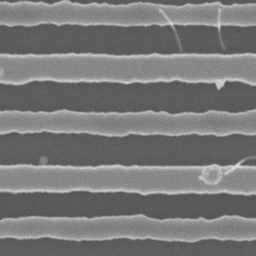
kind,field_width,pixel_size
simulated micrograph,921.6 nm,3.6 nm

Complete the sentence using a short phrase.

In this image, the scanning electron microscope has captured lines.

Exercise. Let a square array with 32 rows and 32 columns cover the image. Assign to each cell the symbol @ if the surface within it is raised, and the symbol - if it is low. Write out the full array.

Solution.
@@@@@@@@@@@@@@--@@@@---@-@@@-@@@
@@@@@@@@@@@@@@@@@@@@@@@@@@@@@@@@
@@@@@@@@@@@@@@@@@@@@@@@@@@@@@@@@
--------------------------------
--------------------------------
--------------------------------
--------------------------------
@@@@@@@@@@@@@@@@@@@@@@@@@@@@@@@@
@@@@@@@@@@@@@@@@@@@@@@@@@@@@@@@@
@@@@@@@@@@@@@@@@@@@@@@@@@@@@@@@@
-@@------------------------@---@
--------------------------------
--------------------------------
--------------------------------
@@@@@@@@@@@@@@@@@@@@@@@@@@@@@@@@
@@@@@@@@@@@@@@@@@@@@@@@@@@@@@@@@
@@@@@-@@@@@@@@@@@@@@@@@@@@@@@@@@
--------------------------------
--------------------------------
--------------------------------
--------------------------------
@@@@@@@@@@@@@@@@@@@@@@@@@@@@@@@@
@@@@@@@@@@@@@@@@@@@@@@@@@@@@@@@@
@@@@@@@@@@@@@@@@@@@@@@@@@@@@@@@@
--------------------------------
--------------------------------
--------------------------------
@@@@@@@@@@@@@@@@@@@@@@@@@@@@@@@@
@@@@@@@@@@@@@@@@@@@@@@@@@@@@@@@@
@@@@@@@@@@@@@@@@@@@@@@@@@@@@@@@@
--------------------------------
--------------------------------